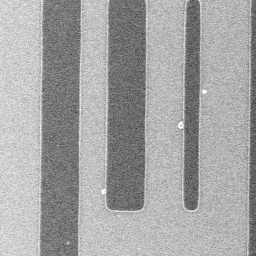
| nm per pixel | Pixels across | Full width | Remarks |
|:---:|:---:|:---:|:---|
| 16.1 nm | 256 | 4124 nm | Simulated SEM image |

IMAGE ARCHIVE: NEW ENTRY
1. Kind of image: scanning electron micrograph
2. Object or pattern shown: groups of lines, slits or small figures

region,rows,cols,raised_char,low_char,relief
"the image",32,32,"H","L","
LLLLLHHHHHLLLHHHHHLLLLLHHLLLLLLH
LLLLLHHHHHLLLHHHHHLLLLLHHLLLLLLH
LLLLLHHHHHLLLHHHHHLLLLLHHLLLLLLH
LLLLLHHHHHLLLHHHHHLLLLLHHLLLLLLH
LLLLLHHHHHLLLHHHHHLLLLLHHLLLLLLH
LLLLLHHHHHLLLHHHHHLLLLLHHLLLLLLH
LLLLLHHHHHLLLHHHHHLLLLLHHLLLLLLH
LLLLLHHHHHLLLHHHHHLLLLLHHLLLLLLH
LLLLLHHHHHLLLHHHHHLLLLLHHLLLLLLH
LLLLLHHHHHLLLHHHHHLLLLLHHLLLLLLH
LLLLLHHHHHLLLHHHHHLLLLLHHLLLLLLH
LLLLLHHHHHLLLHHHHHLLLLLHHLLLLLLH
LLLLLHHHHHLLLHHHHHLLLLLHHLLLLLLH
LLLLLHHHHHLLLHHHHHLLLLLHHLLLLLLH
LLLLLHHHHHLLLHHHHHLLLLLHHLLLLLLH
LLLLLHHHHHLLLHHHHHLLLLHHHLLLLLLH
LLLLLHHHHHLLLHHHHHLLLLLHHLLLLLLH
LLLLLHHHHHLLLHHHHHLLLLLHHLLLLLLH
LLLLLHHHHHLLLHHHHHLLLLLHHLLLLLLH
LLLLLHHHHHLLLHHHHHLLLLLHHLLLLLLH
LLLLLHHHHHLLLHHHHHLLLLLHHLLLLLLH
LLLLLHHHHHLLLHHHHHLLLLLHHLLLLLLH
LLLLLHHHHHLLLHHHHHLLLLLHHLLLLLLH
LLLLLHHHHHLLLHHHHHLLLLLHHLLLLLLH
LLLLLHHHHHLLLHHHHHLLLLLHHLLLLLLH
LLLLLHHHHHLLLHHHHHLLLLLHHLLLLLLH
LLLLLHHHHHLLLLLLLLLLLLLLLLLLLLLH
LLLLLHHHHHLLLLLLLLLLLLLLLLLLLLLH
LLLLLHHHHHLLLLLLLLLLLLLLLLLLLLLH
LLLLLHHHHHLLLLLLLLLLLLLLLLLLLLLH
LLLLLHHHHHLLLLLLLLLLLLLLLLLLLLLH
LLLLLHHHHHLLLLLLLLLLLLLLLLLLLLLH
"